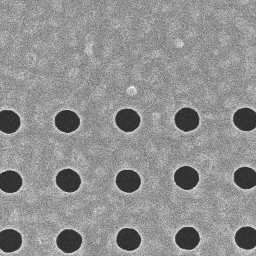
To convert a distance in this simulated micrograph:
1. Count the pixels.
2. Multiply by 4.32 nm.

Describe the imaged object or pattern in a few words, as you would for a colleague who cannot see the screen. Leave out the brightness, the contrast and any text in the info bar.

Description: a regular array of holes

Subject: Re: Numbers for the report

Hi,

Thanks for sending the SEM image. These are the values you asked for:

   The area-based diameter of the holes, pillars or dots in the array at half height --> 24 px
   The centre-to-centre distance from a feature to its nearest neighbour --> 254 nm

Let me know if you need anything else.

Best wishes